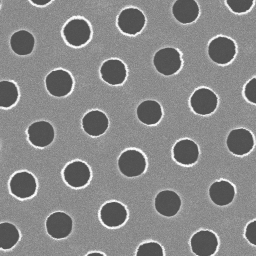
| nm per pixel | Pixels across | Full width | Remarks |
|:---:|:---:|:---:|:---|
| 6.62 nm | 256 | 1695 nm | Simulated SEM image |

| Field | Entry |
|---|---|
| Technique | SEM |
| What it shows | a regular array of holes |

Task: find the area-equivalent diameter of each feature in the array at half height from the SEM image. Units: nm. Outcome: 172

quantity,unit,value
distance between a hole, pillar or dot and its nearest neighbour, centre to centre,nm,356